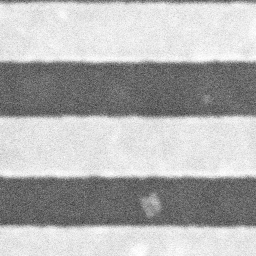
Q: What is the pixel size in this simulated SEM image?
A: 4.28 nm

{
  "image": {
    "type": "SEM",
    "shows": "lines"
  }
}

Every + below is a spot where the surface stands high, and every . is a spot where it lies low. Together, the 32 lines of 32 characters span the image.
+..+++++++....+++++.+.....+..++.
++++++++++++++++++++++++++++++++
++++++++++++++++++++++++++++++++
++++++++++++++++++++++++++++++++
++++++++++++++++++++++++++++++++
++++++++++++++++++++++++++++++++
++++++++++++++++++++++++++++++++
.+++.++....++..+.+.+....+.......
................................
................................
................................
................................
................................
................................
................................
++++++++++++++++++++++++++++++++
++++++++++++++++++++++++++++++++
++++++++++++++++++++++++++++++++
++++++++++++++++++++++++++++++++
++++++++++++++++++++++++++++++++
++++++++++++++++++++++++++++++++
++++++++++++++++++++++++++++++++
................................
................................
................................
................................
................................
................................
+++++.++.+++++++++++++++++....+.
++++++++++++++++++++++++++++++++
++++++++++++++++++++++++++++++++
++++++++++++++++++++++++++++++++